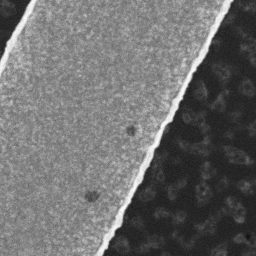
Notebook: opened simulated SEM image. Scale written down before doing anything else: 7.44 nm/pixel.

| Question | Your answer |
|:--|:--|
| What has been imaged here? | one or a few lines or trenches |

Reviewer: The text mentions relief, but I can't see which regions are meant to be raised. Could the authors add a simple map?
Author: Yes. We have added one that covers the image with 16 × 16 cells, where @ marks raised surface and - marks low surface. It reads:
--@@@@@@@@@@@@--
-@@@@@@@@@@@@@--
-@@@@@@@@@@@@---
@@@@@@@@@@@@@---
@@@@@@@@@@@@----
@@@@@@@@@@@@----
@@@@@@@@@@@-----
@@@@@@@@@@------
@@@@@@@@@@------
@@@@@@@@@-------
@@@@@@@@@-------
@@@@@@@@--------
@@@@@@@@--------
@@@@@@@---------
@@@@@@@---------
@@@@@@----------